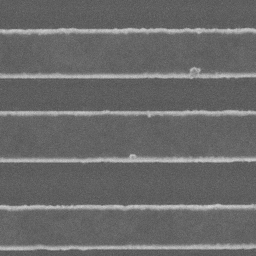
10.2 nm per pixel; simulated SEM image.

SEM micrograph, lines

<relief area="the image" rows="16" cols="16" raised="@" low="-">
----------------
----------------
@@@@@@@@@@@@@@@@
@@@@@@@@@@@@@@@@
@@@@@@@@@@@@@@@@
----------------
----------------
@@@@@@@@@@@@@@@@
@@@@@@@@@@@@@@@@
@@@@@@@@@@@@@@@@
----------------
----------------
----------------
@@@@@@@@@@@@@@@@
@@@@@@@@@@@@@@@@
@@@@@@@@@@------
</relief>